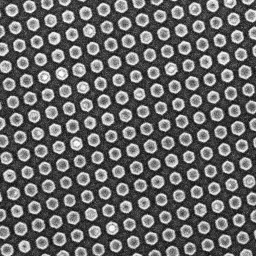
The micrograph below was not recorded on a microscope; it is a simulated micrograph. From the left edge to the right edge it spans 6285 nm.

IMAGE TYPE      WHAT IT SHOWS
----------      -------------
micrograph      a regular array of raised bodies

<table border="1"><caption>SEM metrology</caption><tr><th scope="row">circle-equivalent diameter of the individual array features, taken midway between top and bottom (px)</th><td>11.6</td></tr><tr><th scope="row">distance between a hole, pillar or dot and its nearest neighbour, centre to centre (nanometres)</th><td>436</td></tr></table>